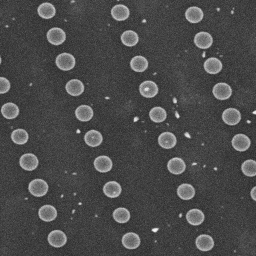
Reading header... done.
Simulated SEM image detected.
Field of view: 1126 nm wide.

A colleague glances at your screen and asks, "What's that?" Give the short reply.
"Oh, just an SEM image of a regular array of raised bodies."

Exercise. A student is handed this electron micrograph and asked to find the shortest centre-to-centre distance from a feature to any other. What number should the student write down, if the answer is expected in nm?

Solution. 119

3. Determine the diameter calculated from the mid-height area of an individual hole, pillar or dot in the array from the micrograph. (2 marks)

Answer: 74.6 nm